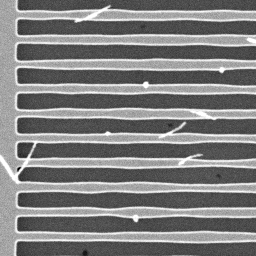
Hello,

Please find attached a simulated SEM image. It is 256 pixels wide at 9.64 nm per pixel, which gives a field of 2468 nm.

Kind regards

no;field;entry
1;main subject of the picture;groups of lines, slits or small figures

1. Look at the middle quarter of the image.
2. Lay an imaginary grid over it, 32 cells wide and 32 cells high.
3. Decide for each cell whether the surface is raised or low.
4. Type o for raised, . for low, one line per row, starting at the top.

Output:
oooooooooooooooooooooooooooooooo
................................
................................
................................
................................
oooooooooooooooooooooooooooooooo
oooooooooooooooooooooooooooooooo
................................
................................
................................
................................
oooooooooooooooooooooooooooooooo
oooooooooooooooooooooooooooooooo
............oooooooooooooooooooo
................................
................................
................................
..........oooooooo.......oo..ooo
oooooooooooooooooooooooooooooooo
oooooooooooooooooooooooooooooooo
................................
................................
................................
...............................o
oooooooooooooooooooooooooooooooo
oooooooooooooooooooooooooooooooo
................................
................................
................................
................................
oooooooooooooooooooooooooooooooo
oooooooooooooooooooooooooooooooo